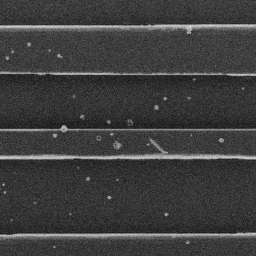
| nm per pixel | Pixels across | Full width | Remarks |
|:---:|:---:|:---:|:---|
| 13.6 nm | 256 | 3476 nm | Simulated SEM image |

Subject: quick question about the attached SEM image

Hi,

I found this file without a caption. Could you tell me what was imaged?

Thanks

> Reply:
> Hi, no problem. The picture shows lines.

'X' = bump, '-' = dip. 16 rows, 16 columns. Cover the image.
----------------
----------------
XXXXXXXXXXXXXXXX
XXXXXXXXXXXXXXXX
XXXXXXXXXXXXXXXX
----------------
----------------
----------------
XXXXXXXXXXXXXXXX
XXXXXXXXXXXXXXXX
----------------
----------------
----------------
----------------
----------------
XXXXXXXXXXXXXXXX